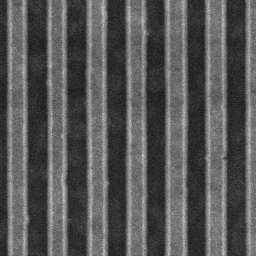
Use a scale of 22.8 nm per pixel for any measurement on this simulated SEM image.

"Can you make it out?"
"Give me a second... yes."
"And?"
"parallel lines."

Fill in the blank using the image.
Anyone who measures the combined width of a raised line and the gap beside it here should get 0.904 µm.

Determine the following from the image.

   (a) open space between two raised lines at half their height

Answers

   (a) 527 nm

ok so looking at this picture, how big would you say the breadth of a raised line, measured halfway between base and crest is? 370 nanometres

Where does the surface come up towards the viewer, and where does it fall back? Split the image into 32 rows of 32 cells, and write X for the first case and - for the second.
-XX---XX---XX---XX---XX---XX---X
-XX---XX---XX---XX---XX---XX---X
-XX---XX---XX---XX---XX---XX---X
-XX---XX---XX---XX---XX---XX---X
-XX---XX---XX---XX---XX---XX---X
-XX---XX---XX---XX---XX---XX---X
-XX---XX---XX---XX---XX---XX---X
-XX---XX---XX---XX---XX---XX---X
-XX---XX---XX---XX---XX---XX---X
-XX---XX---XX---XX---XX---XX---X
-XX---XX---XX---XX---XX---XX---X
-XX---XX---XX---XX---XX---XX---X
-XX---XX---XX---XX---XX---XX---X
-XX---XX---XX---XX---XX---XX---X
-XX---XX---XX---XX---XX---XX---X
-XX---XX---XX---XX---XX---XX---X
-XX---XX---XX---XX---XX---XX---X
-XX---XX---XX---XX---XX---XX---X
-XX---XX---XX---XX---XX---XX---X
-XX---XX---XX---XX---XX---XX---X
-XX---XX---XX---XX---XX---XX---X
-XX---XX---XX---XX---XX---XX---X
-XX---XX---XX---XX---XX---XX---X
-XX---XX---XX---XX---XX---XX---X
-XX---XX---XX---XX---XX---XX---X
-XX---XX---XX---XX---XX---XX---X
-XX---XX---XX---XX---XX---XX---X
-XX---XX---XX---XX---XX---XX---X
-XX---XX---XX---XX---XX---XX---X
-XX---XX---XX---XX---XX---XX---X
-XX---XX---XX---XX---XX---XX---X
-XX---XX---XX---XX---XX---XX---X